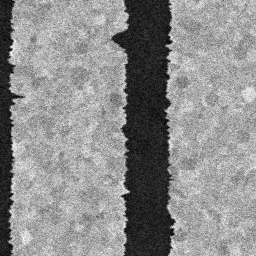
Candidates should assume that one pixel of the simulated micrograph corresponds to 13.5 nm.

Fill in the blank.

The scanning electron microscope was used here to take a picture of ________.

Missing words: one or a few lines or trenches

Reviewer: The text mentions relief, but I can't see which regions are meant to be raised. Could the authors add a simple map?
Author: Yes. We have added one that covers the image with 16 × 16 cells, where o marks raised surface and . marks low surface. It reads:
.ooooooo...ooooo
.ooooooo...ooooo
.oooooo....ooooo
.ooooooo...ooooo
.ooooooo...ooooo
.ooooooo..oooooo
.ooooooo...ooooo
.ooooooo...ooooo
.ooooooo...ooooo
.ooooooo...ooooo
.ooooooo...ooooo
.ooooooo...ooooo
.ooooooo...ooooo
.ooooooo...ooooo
.ooooooo...ooooo
.ooooooo...ooooo